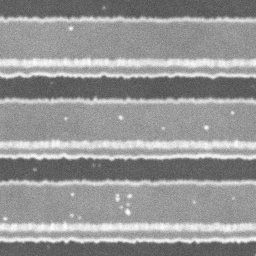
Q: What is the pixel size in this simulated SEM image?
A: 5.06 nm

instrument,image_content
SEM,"lines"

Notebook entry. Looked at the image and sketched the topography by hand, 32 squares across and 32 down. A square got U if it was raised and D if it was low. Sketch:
DDDDDDDDDDDDDDDDDDDDDDDDDDDDDDDD
DDDDDDDDDDDDDDDDDDDDDDDDDDDDDDDD
UUUUUDUUUUUUUUUUUUDDDDUUDDDDUDDD
UUUUUUUUUUUUUUUUUUUUUUUUUUUUUUUU
UUUUUUUUUUUUUUUUUUUUUUUUUUUUUUUU
UUUUUUUUUUUUUUUUUUUUUUUUUUUUUUUU
UUUUUUUUUUUUUUUUUUUUUUUUUUUUUUUU
UUUUUUUUUUUUUUUUUUUUUUUUUUUUUUUU
UUUUUUUUUUUUUUUUUUUUUUUUUUUUUUUU
UUUUDDUDUUUUUUUUUUUUDUDUUDUDUUUU
DDDDDDDDDDDDDDDDDDDDDDDDDDDDDDDD
DDDDDDDDDDDDDDDDDDDDDDDDDDDDDDDD
DDDDDDDDDDDDDDDDDDDDDDDDDDDDDDDD
UUUUUUUUUUUUUUUUUUUUUUUUUUUUUUUU
UUUUUUUUUUUUUUUUUUUUUUUUUUUUUUUU
UUUUUUUUUUUUUUUUUUUUUUUUUUUUUUUU
UUUUUUUUUUUUUUUUUUUUUUUUUUUUUUUU
UUUUUUUUUUUUUUUUUUUUUUUUUUUUUUUU
UUUUUUUUUUUUUUUUUUUUUUUUUUUUUUUU
UUUUUUUUUUUUUUUUUUUUUUUUUUUUUUUU
DDDDDDDDDDDDDDDDDDDDDDDDDDDDDDDD
DDDDDDDDDDDDDDDDDDDDDDDDDDDDDDDD
DDDDDDDDDDDDDDDDDDDDDDDDDDDDDDDD
UUUUUUUUUUUUUUUUUUUUUUUUUUUUUUUU
UUUUUUUUUUUUUUUUUUUUUUUUUUUUUUUU
UUUUUUUUUUUUUUUUUUUUUUUUUUUUUUUU
UUUUUUUUUUUUUUUUUUUUUUUUUUUUUUUU
UUUUUUUUUUUUUUUUUUUUUUUUUUUUUUUU
UUUUUUUUUUUUUUUUUUUUUUUUUUUUUUUU
UUUUUUUUUUUUUUUUUUUUUUUUUUUUUUUU
DDDDDDDDDDDDDDDDDDDDDDDDDDDDDDDD
DDDDDDDDDDDDDDDDDDDDDDDDDDDDDDDD